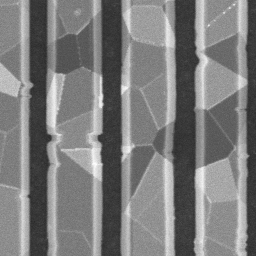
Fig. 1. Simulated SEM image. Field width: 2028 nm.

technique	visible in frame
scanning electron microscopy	one or a few lines or trenches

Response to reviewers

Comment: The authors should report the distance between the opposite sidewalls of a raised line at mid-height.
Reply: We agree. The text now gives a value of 344 nm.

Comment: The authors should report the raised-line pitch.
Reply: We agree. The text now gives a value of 0.579 microns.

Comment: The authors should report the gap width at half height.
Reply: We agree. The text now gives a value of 223 nm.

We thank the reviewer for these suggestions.